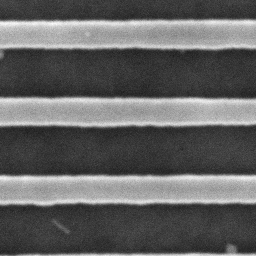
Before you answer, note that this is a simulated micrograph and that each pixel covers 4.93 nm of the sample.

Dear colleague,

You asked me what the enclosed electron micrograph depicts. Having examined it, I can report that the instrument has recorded lines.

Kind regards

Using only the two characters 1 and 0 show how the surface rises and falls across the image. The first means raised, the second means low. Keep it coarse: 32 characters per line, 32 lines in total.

00000000000000000000000000000000
00000000000000000000000000000000
00000000000000000000000000000000
11111111111111111111111111111111
11111111111111111111111111111111
11111111111111111111111111111111
00000000000000000000000000000000
00000000000000000000000000000000
00000000000000000000000000000000
00000000000000000000000000000000
00000000000000000000000000000000
00000000000000000000000000000000
11111111111111111111111111011000
11111111111111111111111111111111
11111111111111111111111111111111
11111111111111111111111110000010
00000000000000000000000000000000
00000000000000000000000000000000
00000000000000000000000000000000
00000000000000000000000000000000
00000000000000000000000000000000
00000000000000000000000000000000
11111111111111111111111111111111
11111111111111111111111111111111
11111111111111111111111111111111
00000100000000000000000000000000
00000000000000000000000000000000
00000000000000000000000000000000
00000000000000000000000000000000
00000000000000000000000000000000
00000000000000000000000000000000
00000000000000000000000000000000